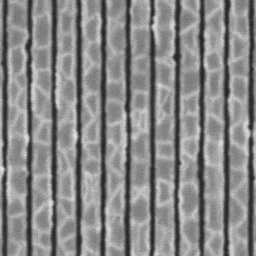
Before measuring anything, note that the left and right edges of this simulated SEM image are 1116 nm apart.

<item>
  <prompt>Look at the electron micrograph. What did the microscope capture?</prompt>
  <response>parallel lines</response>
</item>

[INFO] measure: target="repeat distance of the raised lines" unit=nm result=107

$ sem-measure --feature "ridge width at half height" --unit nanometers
83.3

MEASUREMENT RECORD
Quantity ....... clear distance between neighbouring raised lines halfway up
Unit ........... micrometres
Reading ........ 0.0267